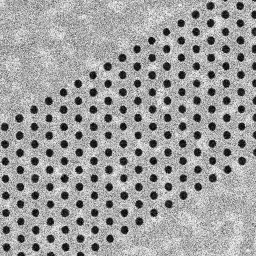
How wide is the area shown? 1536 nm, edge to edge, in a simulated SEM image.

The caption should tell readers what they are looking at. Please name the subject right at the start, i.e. a regular array of holes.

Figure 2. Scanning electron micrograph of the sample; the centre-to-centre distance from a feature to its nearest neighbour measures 16.9 pixels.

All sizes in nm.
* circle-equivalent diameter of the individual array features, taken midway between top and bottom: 47.9